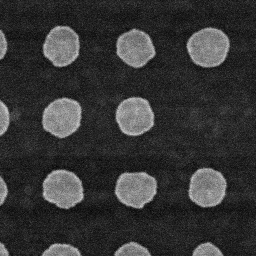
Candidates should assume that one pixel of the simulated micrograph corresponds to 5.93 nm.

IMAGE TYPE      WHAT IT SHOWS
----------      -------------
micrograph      a regular array of raised bodies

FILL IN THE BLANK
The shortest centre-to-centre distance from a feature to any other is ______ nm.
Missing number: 423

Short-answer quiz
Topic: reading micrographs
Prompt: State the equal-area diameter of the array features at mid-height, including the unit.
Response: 224 nanometers